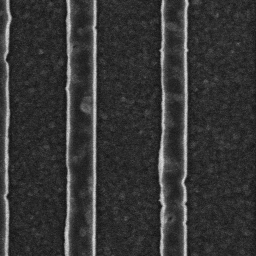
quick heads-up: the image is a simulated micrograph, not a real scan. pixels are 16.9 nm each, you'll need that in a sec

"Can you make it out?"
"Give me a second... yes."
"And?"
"one or a few lines or trenches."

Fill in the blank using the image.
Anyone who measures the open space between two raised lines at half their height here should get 1.09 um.